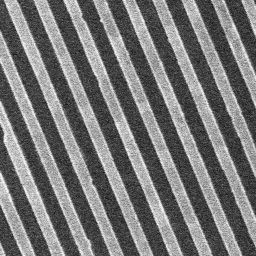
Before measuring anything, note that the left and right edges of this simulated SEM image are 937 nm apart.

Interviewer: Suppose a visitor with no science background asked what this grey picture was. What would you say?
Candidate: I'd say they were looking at parallel lines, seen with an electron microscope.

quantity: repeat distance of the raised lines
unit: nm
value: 99.8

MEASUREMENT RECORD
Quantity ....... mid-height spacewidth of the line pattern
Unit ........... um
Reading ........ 0.0612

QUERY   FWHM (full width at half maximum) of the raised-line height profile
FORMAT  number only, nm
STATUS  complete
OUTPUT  38.8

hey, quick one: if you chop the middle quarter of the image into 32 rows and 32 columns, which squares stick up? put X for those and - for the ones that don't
XX-----XXX----XXX-----XX-----XXX
XXX----XXX-----XXX----XXX----XXX
XXX-----XXX----XXX----XXX-----XX
-XXX----XXX----XXX-----XXX----XX
-XXX-----XX-----XXX----XXX-----X
-XXXX----XXX----XXX-----XX-----X
--XXX----XXX-----XXX----XXX----X
--XXX-----XXX----XXX-----XXX----
---XXX----XXX-----XXX----XXX----
---XXX-----XX-----XXX-----XX----
----XX-----XXX----XXX-----XXX---
----XXX----XXX-----XXX----XXX---
----XXX-----XXX----XXX-----XX---
-----XXX----XXX-----XXX----XXX--
X----XXX-----XX-----XXX----XXX--
X-----XX-----XXX----XXX-----XXX-
X-----XXX-----XX-----XXX----XXX-
XX-----XX-----XXX----XXX-----XXX
XX-----XXX-----XX-----XXX----XXX
XXX----XXX-----XXX----XXX-----XX
XXX-----XXX----XXX-----XX-----XX
-XXX----XXX-----XX-----XXX----XX
-XXX-----XX-----XXX----XXX-----X
--XX-----XXX----XXX-----XXX----X
--XXX----XXX-----XXX----XXX-----
--XXX-----XXX----XXX-----XX-----
---XXX----XXX-----XXX----XXX----
---XXX-----XXX----XXX----XXX----
----XXX----XXX----XXX-----XXX---
----XXX-----XXX----XXX----XXX---
-----XX-----XXX-----XX-----XXX--
-----XXX----XXX-----XXX----XXX--